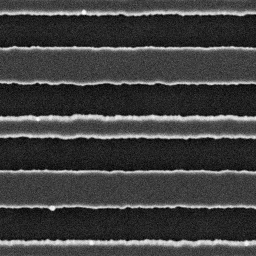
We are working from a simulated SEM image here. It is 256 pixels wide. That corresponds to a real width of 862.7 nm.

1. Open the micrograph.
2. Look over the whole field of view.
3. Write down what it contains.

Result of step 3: lines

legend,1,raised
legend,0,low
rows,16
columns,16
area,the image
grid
1111111111111111
0000000000000000
0000000000000000
1111111111111111
1111111111111111
0000000000000000
0000000000000000
1111111111111111
1111111111111111
0000000000000000
0000000000000000
1111111111111111
1111111111111111
0000000000000000
0000000000000000
1111111111111111